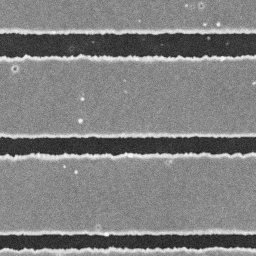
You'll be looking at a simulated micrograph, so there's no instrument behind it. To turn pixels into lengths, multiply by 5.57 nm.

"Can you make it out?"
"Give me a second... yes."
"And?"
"lines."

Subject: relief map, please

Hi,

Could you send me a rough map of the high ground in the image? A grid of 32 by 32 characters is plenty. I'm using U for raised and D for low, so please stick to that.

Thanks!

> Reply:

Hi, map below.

UUUUUUUUUUUUUUUUUUUUUUUUUUUUUUUU
UUUUUUUUUUUUUUUUUUUUUUUUUUUUUUUU
UUUUUUUUUUUUUUUUUUUUUUUUUUUUUUUU
UUUUUUUUUUUUUUUUUUUUUUUUUUUUUUUU
DDDDDDDDDDDDDDDDDDDDDDDDDDDDDDDD
DDDDDDDDDDDDDDDDDDDDDDDDDDDDDDDD
DDDDDDDDDDDDDDDDDDDDDDDDDDDDDDDD
UUUUUUUUUUUUUUUUUUUUUUUUUUUUUUUU
UUUUUUUUUUUUUUUUUUUUUUUUUUUUUUUU
UUUUUUUUUUUUUUUUUUUUUUUUUUUUUUUU
UUUUUUUUUUUUUUUUUUUUUUUUUUUUUUUU
UUUUUUUUUUUUUUUUUUUUUUUUUUUUUUUU
UUUUUUUUUUUUUUUUUUUUUUUUUUUUUUUU
UUUUUUUUUUUUUUUUUUUUUUUUUUUUUUUU
UUUUUUUUUUUUUUUUUUUUUUUUUUUUUUUU
UUUUUUUUUUUUUUUUUUUUUUUUUUUUUUUU
UUUUUUUUUUUUUUUUUUUUUUUUUUUUUUUU
DDDDDDDDDDDDDDDDDDDDDDDDDDDDDDDD
DDDDDDDDDDDDDDDDDDDDDDDDDDDDDDDD
DDUUUUUUUUUUUUUUUUUUUUUUUUUUUUUU
UUUUUUUUUUUUUUUUUUUUUUUUUUUUUUUU
UUUUUUUUUUUUUUUUUUUUUUUUUUUUUUUU
UUUUUUUUUUUUUUUUUUUUUUUUUUUUUUUU
UUUUUUUUUUUUUUUUUUUUUUUUUUUUUUUU
UUUUUUUUUUUUUUUUUUUUUUUUUUUUUUUU
UUUUUUUUUUUUUUUUUUUUUUUUUUUUUUUU
UUUUUUUUUUUUUUUUUUUUUUUUUUUUUUUU
UUUUUUUUUUUUUUUUUUUUUUUUUUUUUUUU
UUUUUUUUUUUUUUUUUUUUUUUUUUUUUUUU
DDDDDDDDDDDDDDDDDDDDDDDDDDDDDDDD
DDDDDDDDDDDDDDDDDDDDDDDDDDDDDDDD
UUUUUUUUUUUUUUUUUUUUUUUUUUUUUUUU